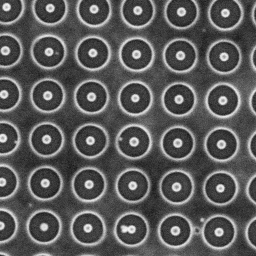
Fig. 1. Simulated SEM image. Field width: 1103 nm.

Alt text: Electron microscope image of an array of small figures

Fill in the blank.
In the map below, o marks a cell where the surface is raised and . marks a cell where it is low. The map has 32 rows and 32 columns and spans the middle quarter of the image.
ooooo.....ooooo......ooooo......
oooooooooooooooooo.oooooooo....o
oooooooooooooooooooooooooooooooo
oooooooooooooooooooooooooooooooo
oooooo..oooooooooooooooooooooooo
oooo.....oooooo.....ooooooo....o
ooo.......oooo.......ooooo......
ooo...o....ooo.......oooo.......
ooo...oo...ooo...oo...ooo...oo..
ooo.......oooo........ooo...oo..
oooo......oooo.......oooo.......
ooooo....oooooo.....oooooo......
ooooooooooooooooo.oooooooooo..oo
oooooooooooooooooooooooooooooooo
oooooooooooooooooooooooooooooooo
ooooo...ooooooooo.oooooooooooooo
oooo......ooooo.....oooooo.....o
ooo.......oooo.......oooo......o
ooo...o....ooo.......oooo.......
ooo...o....oo....o....ooo...o...
ooo.......oooo.......oooo...o...
oooo......oooo.......oooo.......
oooo.....oooooo.....oooooo.....o
ooooooooooooooooooooooooooo..ooo
oooooooooooooooooooooooooooooooo
oooooooooooooooooooooooooooooooo
ooooo...oooooooooooooooooooooooo
ooo......oooooo.....oooooo....oo
ooo.......oooo.......oooo......o
oo....o...ooo........ooo........
oo....o...ooo...oo...ooo...oo...
ooo.......ooo........ooo...oo...